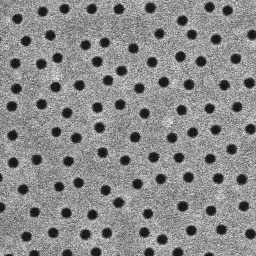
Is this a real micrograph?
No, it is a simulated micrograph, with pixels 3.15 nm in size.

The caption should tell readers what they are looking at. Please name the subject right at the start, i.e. a regular array of holes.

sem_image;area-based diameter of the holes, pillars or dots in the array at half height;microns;0.0336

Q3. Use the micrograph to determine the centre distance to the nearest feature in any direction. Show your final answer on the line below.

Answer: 0.0705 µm